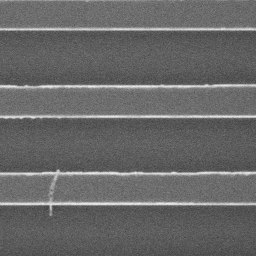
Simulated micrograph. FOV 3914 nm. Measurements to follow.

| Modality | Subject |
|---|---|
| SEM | lines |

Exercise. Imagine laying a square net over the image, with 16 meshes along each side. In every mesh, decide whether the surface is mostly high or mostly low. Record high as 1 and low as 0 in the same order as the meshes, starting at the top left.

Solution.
1111111111111111
1111111111111111
0000000000000000
0000000000000000
0000000000000000
1111111111111111
1111111111111111
0000000000000000
0000000000000000
0000000000000000
0000000000000000
1111111111111111
1111111111111111
0000000000000000
0000000000000000
0000000000000000